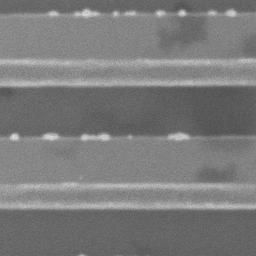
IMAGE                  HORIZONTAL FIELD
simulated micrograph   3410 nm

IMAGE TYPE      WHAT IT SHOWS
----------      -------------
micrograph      lines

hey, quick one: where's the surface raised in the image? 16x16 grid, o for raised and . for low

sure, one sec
................
oooooooooooooooo
oooooooooooooooo
oooooooooooooooo
oooooooooooooooo
................
................
................
...o.oo....o....
oooooooooooooooo
oooooooooooooooo
oooooooooooooooo
oooooooooooooooo
................
................
................